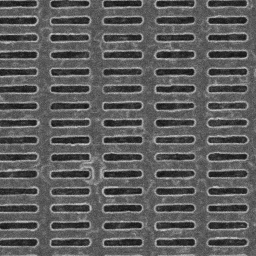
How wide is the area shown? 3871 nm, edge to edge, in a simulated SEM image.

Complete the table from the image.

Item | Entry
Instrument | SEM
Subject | a regular array of holes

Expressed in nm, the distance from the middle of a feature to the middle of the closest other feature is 253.